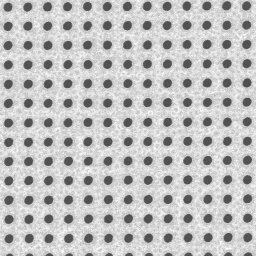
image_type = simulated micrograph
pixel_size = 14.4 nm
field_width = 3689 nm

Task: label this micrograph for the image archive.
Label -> a regular array of holes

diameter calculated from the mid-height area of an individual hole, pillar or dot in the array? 132 nanometres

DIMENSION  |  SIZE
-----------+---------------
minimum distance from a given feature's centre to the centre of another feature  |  19.2 px